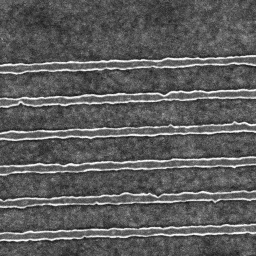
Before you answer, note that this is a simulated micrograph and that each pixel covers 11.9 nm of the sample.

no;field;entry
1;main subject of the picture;parallel lines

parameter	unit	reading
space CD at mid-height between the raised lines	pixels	25.6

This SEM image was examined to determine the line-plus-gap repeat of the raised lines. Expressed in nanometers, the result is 402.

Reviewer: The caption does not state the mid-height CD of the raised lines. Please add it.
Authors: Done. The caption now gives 94 nm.